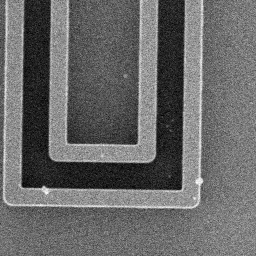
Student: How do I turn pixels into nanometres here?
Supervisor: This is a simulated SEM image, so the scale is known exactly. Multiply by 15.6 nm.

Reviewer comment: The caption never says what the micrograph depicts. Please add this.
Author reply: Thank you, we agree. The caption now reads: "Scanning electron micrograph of groups of lines, slits or small figures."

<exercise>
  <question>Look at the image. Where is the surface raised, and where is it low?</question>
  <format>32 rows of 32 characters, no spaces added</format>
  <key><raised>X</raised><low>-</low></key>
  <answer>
-XX---XX----------XX---XX-------
-XX---XX----------XX---XX-------
-XX---XX----------XX---XX-------
-XX---XX----------XX---XX-------
-XX---XX----------XX---XX-------
-XX---XX----------XX---XX-------
-XX---XX---------XXX---XX-------
-XX---XX---------XXX---XX-------
-XX---XX---------XXX---XX-------
-XX---XX---------XXX---XX-------
-XX---XX---------XXX---XX-------
-XX---XX---------XXX---XX-------
-XX---XX---------XXX---XX-------
-XX---XX---------XXX---XX-------
-XX---XX---------XXX---XX-------
-XX---XX---------XXX---XX-------
-XX---XX---------XX----XX-------
-XX---XX---------XX----XX-------
-XX---XXXXXXXXXXXXX----XX-------
-XX---XXXXXXXXXXXXX----XX-------
-XX--------------------XX-------
-XX--------------------XX-------
-XX--------------------XX-------
XXX--X-----------------XX-------
XXXXXXXXXXXXXXXXXXXXXXXXX-------
-XXXXXXXXXXXXXXXXXXXXXXXX-------
--------------------------------
--------------------------------
--------------------------------
--------------------------------
--------------------------------
--------------------------------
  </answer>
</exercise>